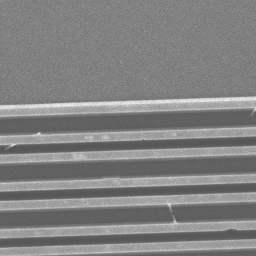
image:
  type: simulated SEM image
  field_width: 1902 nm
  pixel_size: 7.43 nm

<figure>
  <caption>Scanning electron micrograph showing parallel lines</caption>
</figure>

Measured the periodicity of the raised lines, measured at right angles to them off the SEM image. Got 175 nm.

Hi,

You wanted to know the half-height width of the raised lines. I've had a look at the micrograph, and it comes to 0.078 micrometres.